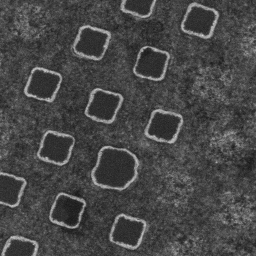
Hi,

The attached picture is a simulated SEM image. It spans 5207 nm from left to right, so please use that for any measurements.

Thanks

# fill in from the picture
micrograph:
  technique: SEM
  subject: a regular array of raised bodies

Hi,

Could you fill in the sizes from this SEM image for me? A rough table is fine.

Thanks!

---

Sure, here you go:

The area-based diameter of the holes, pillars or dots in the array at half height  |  674 nm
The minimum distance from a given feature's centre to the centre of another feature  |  1.3 micrometres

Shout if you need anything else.